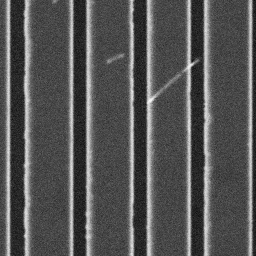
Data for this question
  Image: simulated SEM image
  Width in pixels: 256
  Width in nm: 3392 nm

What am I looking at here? lines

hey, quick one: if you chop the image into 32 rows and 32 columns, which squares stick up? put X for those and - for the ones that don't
X--XXXXXX--XXXXX---XXXXX--XXXXX-
X--XXXXXX--XXXXX--XXXXXX--XXXXX-
X--XXXXXX--XXXXX--XXXXXX--XXXXX-
X--XXXXXX--XXXXX--XXXXXX--XXXXX-
X--XXXXXX--XXXXXX--XXXXX--XXXXX-
X--XXXXXX--XXXXXX--XXXXX--XXXXX-
X--XXXXXX--XXXXXX-XXXXXX--XXXXX-
X--XXXXXX--XXXXXX--XXXXX--XXXXX-
X--XXXXXX--XXXXX---XXXXX--XXXXX-
X--XXXXXX--XXXXX---XXXXX--XXXXX-
X--XXXXXX--XXXXXX--XXXXX--XXXXX-
X--XXXXXX--XXXXX---XXXXX--XXXXX-
X--XXXXXX--XXXXX--XXXXXX--XXXXX-
X--XXXXXX--XXXXXX--XXXXX--XXXXX-
X--XXXXXX--XXXXXX--XXXXX--XXXXX-
X--XXXXXX--XXXXXX--XXXXX--XXXXX-
X--XXXXXX--XXXXX---XXXXX--XXXXX-
X--XXXXXX--XXXXXX-XXXXXX--XXXXX-
X--XXXXXX--XXXXXX--XXXXX--XXXXX-
X--XXXXXX--XXXXXX--XXXXX--XXXXX-
X--XXXXXX--XXXXXX--XXXXX--XXXXX-
X--XXXXXX--XXXXXX--XXXXX--XXXXX-
X--XXXXXX--XXXXXX--XXXXX--XXXXX-
X--XXXXXX--XXXXXX-XXXXXX--XXXXX-
X--XXXXXX--XXXXXX--XXXXX--XXXXX-
X--XXXXXX--XXXXX---XXXXX--XXXXX-
X--XXXXXX--XXXXX---XXXXX--XXXXX-
X--XXXXXX--XXXXX---XXXXX--XXXXX-
X--XXXXXX--XXXXX--XXXXXX--XXXXX-
X--XXXXXX--XXXXX---XXXXX--XXXXX-
X--XXXXXX--XXXXXX--XXXXX--XXXXX-
X--XXXXXX--XXXXXX--XXXXX--XXXXX-